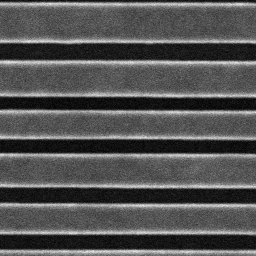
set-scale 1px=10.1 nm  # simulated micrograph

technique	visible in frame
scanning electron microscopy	lines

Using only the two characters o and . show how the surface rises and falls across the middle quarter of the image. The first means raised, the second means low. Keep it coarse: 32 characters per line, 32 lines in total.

oooooooooooooooooooooooooooooooo
oooooooooooooooooooooooooooooooo
oooooooooooooooooooooooooooooooo
oooooooooooooooooooooooooooooooo
oooooooooooooooooooooooooooooooo
oooooooooooooooooooooooooooooooo
oooooooooooooooooooooooooooooooo
oooooooooooooooooooooooooooooooo
................................
................................
................................
................................
oooooooooooooooooooooooooooooooo
oooooooooooooooooooooooooooooooo
oooooooooooooooooooooooooooooooo
oooooooooooooooooooooooooooooooo
oooooooooooooooooooooooooooooooo
oooooooooooooooooooooooooooooooo
oooooooooooooooooooooooooooooooo
................................
................................
................................
................................
oooooooooooooooooooooooooooooooo
oooooooooooooooooooooooooooooooo
oooooooooooooooooooooooooooooooo
oooooooooooooooooooooooooooooooo
oooooooooooooooooooooooooooooooo
oooooooooooooooooooooooooooooooo
oooooooooooooooooooooooooooooooo
oooooooooooooooooooooooooooooooo
................................